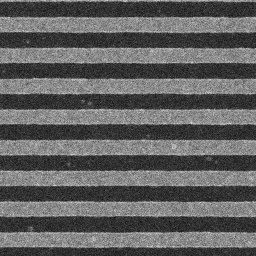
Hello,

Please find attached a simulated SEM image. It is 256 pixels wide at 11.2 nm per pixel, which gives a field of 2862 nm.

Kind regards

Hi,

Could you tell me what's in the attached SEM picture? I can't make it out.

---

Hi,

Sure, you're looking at parallel lines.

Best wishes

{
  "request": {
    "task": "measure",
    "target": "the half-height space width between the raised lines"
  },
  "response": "184 nm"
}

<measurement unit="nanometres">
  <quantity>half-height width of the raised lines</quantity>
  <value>158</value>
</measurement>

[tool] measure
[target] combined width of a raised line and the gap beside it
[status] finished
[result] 0.343 µm